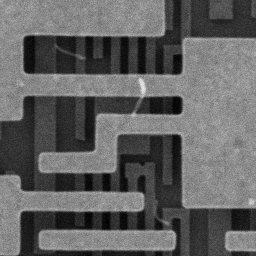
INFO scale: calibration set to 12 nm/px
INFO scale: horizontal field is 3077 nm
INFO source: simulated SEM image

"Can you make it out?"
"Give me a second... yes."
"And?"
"wiring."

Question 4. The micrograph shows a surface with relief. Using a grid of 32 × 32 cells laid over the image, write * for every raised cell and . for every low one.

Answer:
********************............
********************............
********************............
********************............
***...............**............
***....................*********
***....................*********
***....................*********
***....................*********
********************************
********************************
********************************
***....................*********
***....................*********
***.........********************
............********************
............********************
............***........*********
............***........*********
.....**********........*********
.....**********........*********
.....*********.........*********
**.....................*********
***....................*********
******************.....*********
******************.....*********
***.............................
**..............................
**..............................
**...*****************......****
**...*****************......****
**..............................